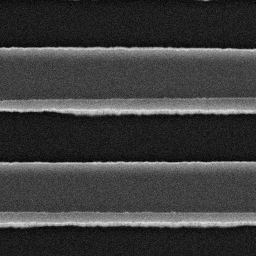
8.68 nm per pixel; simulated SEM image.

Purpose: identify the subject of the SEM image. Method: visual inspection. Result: lines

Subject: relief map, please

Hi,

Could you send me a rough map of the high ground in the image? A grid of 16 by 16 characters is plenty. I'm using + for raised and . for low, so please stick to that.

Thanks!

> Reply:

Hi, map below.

................
................
................
++++++++++++++++
++++++++++++++++
++++++++++++++++
++++++++++++++++
................
................
................
++++++++++++++++
++++++++++++++++
++++++++++++++++
++++++++++++++++
................
................